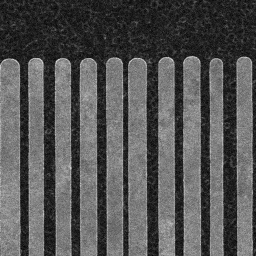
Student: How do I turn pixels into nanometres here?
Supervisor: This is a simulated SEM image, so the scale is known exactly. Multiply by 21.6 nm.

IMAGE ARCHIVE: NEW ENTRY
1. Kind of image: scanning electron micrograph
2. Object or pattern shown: parallel lines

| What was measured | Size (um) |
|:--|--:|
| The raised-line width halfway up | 0.338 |